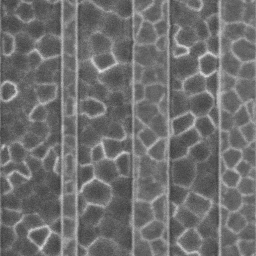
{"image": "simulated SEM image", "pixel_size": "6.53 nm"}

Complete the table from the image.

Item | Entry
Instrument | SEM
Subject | one or a few lines or trenches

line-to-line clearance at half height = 349 nanometers